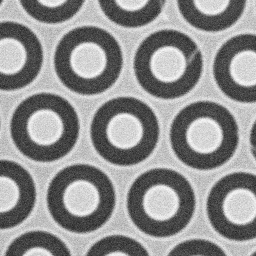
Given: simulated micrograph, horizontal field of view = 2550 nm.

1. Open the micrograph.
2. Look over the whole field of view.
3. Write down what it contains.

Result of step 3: an array of small figures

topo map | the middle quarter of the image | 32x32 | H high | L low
LLHHHHHHHHLLLLLHHLLLLLHHHHHHHHLL
LLLHHHHHHLLLLLLHHLLLLLHHHHHHHHLL
LLLLHHHHHLLLLLHHHLLLLLLHHHHHHLLL
LLLLLLLLLLLLLLHHHHLLLLLLHHHHLLLL
LLLLLLLLLLLLLHHHHHLLLLLLLLLLLLLL
LLLLLLLLLLLLHHHHHHHLLLLLLLLLLLLL
HLLLLLLLLLLHHHHHHHHHLLLLLLLLLLLL
HHHLLLLLLLHHHHHHHHHHHLLLLLLLLLLH
LHHHHHHHHHHHLLLLLLHHHHHLLLLLLLHH
LLHHHHHHHHLLLLLLLLLLHHHHHHHHHHHL
LLLHHHHHHLLLLLLLLLLLLLHHHHHHHHLL
LLLHHHHHLLLLLLLLLLLLLLLHHHHHHLLL
LLLLHHHLLLLLLLLLLLLLLLLHHHHHLLLL
LLLLHHHLLLLLLHHHHHLLLLLLHHHLLLLL
LLLLHHHLLLLLHHHHHHHLLLLLHHHLLLLL
LLLLHHLLLLLHHHHHHHHLLLLLHHLLLLLL
LLLLHHLLLLLHHHHHHHHLLLLLHHLLLLLH
LLLLHHLLLLLHHHHHHHHLLLLLHHLLLLLH
LLLLHHLLLLLLHHHHHHHLLLLLHHLLLLLH
LLLHHHHLLLLLHHHHHHLLLLLLHHLLLLLH
LLLHHHHLLLLLLLHHHLLLLLLHHHLLLLLL
LLHHHHHHLLLLLLLLLLLLLLLHHHHLLLLL
LHHHHHHHLLLLLLLLLLLLLLHHHHHLLLLL
HHHHHHHHHLLLLLLLLLLLLHHHHHHHLLLL
HHHHHHHHHHLLLLLLLLLLHHHHHHHHHLLL
LLLLLLLLHHHHHLLLLHHHHHHHHHHHHHLL
LLLLLLLLLLHHHHHHHHHHLLLLLLLLHHHH
LLLLLLLLLLLHHHHHHHHLLLLLLLLLLLHH
LLLLLLLLLLLLHHHHHHLLLLLLLLLLLLLH
LLLHHLLLLLLLHHHHHLLLLLLLLLLLLLLL
LHHHHHHLLLLLLHHHLLLLLLLLLLLLLLLL
LHHHHHHHLLLLLHHHLLLLLLHHHHHLLLLL